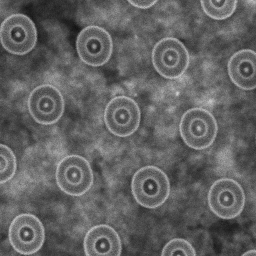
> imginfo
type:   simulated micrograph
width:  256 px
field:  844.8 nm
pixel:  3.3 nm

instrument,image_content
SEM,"a regular array of ring-shaped raised bodies with a dot in the middle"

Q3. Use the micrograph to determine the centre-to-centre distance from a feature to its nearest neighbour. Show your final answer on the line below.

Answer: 249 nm